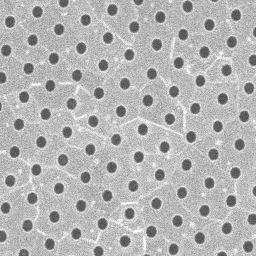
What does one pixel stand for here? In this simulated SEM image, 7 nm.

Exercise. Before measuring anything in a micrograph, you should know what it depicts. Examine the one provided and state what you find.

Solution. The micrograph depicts a regular array of holes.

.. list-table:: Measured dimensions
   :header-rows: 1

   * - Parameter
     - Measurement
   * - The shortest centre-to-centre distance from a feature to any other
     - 195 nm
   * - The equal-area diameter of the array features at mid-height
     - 82.1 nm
